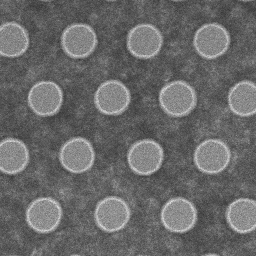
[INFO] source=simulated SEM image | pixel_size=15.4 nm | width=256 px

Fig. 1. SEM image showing a regular array of raised bodies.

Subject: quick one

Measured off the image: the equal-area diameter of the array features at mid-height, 526 nanometers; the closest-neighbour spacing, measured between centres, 1020 nm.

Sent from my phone